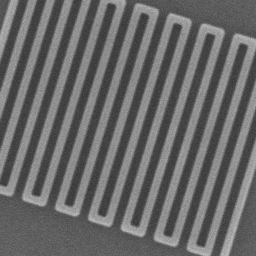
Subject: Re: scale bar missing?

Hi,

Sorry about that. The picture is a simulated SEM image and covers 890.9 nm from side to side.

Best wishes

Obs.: groups of lines, slits or small figures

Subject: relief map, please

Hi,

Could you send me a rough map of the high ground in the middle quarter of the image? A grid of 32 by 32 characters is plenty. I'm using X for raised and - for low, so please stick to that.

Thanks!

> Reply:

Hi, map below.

XX--XX--XX---XX---X---XX---XX--X
X---XX--XX---XX--XX---XX--XX---X
X---XX--XX--XX---XX--XX---XX--XX
X--XX---XX--XX---XX--XX---XX--XX
---XX---X---XX--XX---XX--XX---XX
---XX--XX--XX---XX---X---XX---XX
--XX---XX--XX---XX--XX---XX--XX-
--XX---X---XX--XX---XX--XX---XX-
--XX--XX---XX--XX---XX--XX---XX-
-XX---XX--XX---XX--XX---XX--XX--
-XX---X---XX--XX---XX--XX---XX--
-XX--XX---XX--XX---XX--XX---XX--
-XX--XX--XX---XX--XX---XX--XX---
XX---XX--XX---X---XX---XX--XX---
XX--XX---XX--XX---XX--XX---XX--X
XX--XX--XX---XX--XX---XX--XX---X
X---XX--XX---XX--XX---XX--XX---X
X---X---XX--XX---XX--XX---XX--XX
X--XX---X---XX---X---XX---XX--XX
---XX--XX---XX--XX---XX--XX---XX
---XX--XX--XX---XX--XX---XX--XX-
--XX---XX--XX---XX--XX---XX--XX-
--XX---X---XX--XX---XX--XX---XX-
--XX--XX--XX---XX---X---XX---XX-
-XX---XX--XX---XX--XX---XX--XX--
-XX---X---XX--XX---XX--XX---XX--
-XX--XX---XX--XX---XX--XX---XX--
XX---XX--XX---XX--XX---XX--XX---
XX---XX--XX--XX---XX--XX---XX---
XX--XX---XX--XX---XX--XX---XX--X
X---XX--XX---XX--XX---XX--XX---X
X---XX--XX---X---XX---XX--XX---X